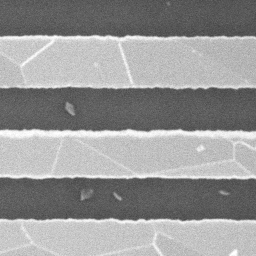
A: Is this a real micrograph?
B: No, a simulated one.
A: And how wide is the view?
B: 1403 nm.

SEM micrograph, lines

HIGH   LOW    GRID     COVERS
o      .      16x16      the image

................
................
oooooooooooooooo
oooooooooooooooo
oooooooooooooooo
............o...
................
................
oooooooooooooooo
oooooooooooooooo
oooooooooooooooo
................
................
................
oooooooooooooooo
oooooooooooooooo